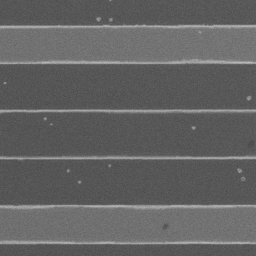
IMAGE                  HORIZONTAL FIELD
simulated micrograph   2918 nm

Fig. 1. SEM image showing lines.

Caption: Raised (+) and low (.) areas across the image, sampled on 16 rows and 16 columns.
................
................
++++++++++++++++
++++++++++++++++
................
................
................
++++++++++++++++
++++++++++++++++
++++++++++++++++
................
................
................
++++++++++++++++
++++++++++++++++
................